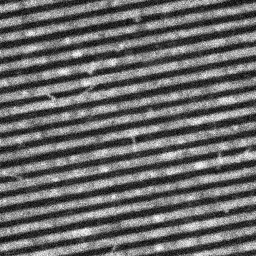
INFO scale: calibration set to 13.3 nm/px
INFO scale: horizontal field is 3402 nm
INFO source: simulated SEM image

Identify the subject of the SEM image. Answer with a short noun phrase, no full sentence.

parallel lines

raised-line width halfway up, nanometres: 89.9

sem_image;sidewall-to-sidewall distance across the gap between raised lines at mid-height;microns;0.103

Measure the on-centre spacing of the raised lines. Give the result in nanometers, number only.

195